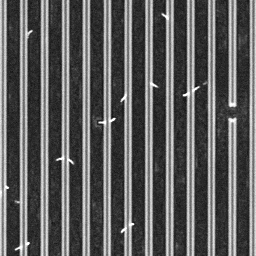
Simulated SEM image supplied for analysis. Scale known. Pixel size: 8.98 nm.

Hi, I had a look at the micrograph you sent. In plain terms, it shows parallel lines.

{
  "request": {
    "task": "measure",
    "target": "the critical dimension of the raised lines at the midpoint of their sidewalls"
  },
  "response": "49.4 nanometres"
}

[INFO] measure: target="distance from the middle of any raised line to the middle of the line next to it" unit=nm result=187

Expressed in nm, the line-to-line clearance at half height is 138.